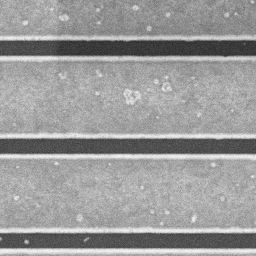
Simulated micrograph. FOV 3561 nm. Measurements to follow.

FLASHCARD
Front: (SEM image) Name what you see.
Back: lines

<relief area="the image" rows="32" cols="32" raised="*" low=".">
********************************
********************************
********************************
********************************
********************************
................................
................................
********************************
********************************
********************************
********************************
********************************
********************************
********************************
********************************
********************************
********************************
................................
................................
********************************
********************************
********************************
********************************
********************************
********************************
********************************
********************************
********************************
********************************
................................
................................
********************************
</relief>